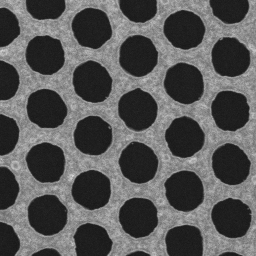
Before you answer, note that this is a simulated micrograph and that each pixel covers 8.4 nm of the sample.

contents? a regular array of holes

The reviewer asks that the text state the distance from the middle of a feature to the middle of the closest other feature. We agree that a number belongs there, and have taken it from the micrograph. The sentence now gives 52.9 px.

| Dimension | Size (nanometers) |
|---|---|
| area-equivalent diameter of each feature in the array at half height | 337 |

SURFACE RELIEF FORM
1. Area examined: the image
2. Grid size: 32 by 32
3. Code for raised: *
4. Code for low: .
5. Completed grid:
***.....*******.....******.....*
.***....**...**.....**..***....*
..*******.....**...**....***..**
..*******.....******......******
..***.***.....***.***....*******
.***....**...**....**....**...**
***.....*******.....******.....*
***.....*******.....******.....*
..**....**...**....**....**....*
..*******.....***.***....***..**
..*******.....*******....*******
..**...**.....**..***....***..**
.**.....***..**....***...**....*
***.....*******.....******.....*
.**.....***.***.....*******....*
..**....**....**...**....**....*
..*******.....*******....*******
..*******.....*******....*******
..**....**...***...**....**...**
***.....*******.....**..***....*
***.....*******.....*******....*
.***....**..***.....**..***....*
..***..**.....**...**....***...*
..*******.....*******....*******
..***..**.....*******....*******
..**....**...**....**....**....*
***.....*******.....******.....*
****....*******.....*******....*
..**....**...**....***...**....*
..*******.....**..***....***..**
...******.....*******....*******
..***..**.....***.***....*******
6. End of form